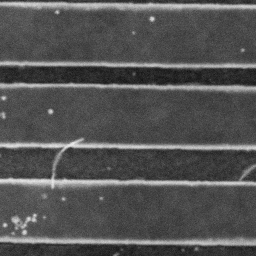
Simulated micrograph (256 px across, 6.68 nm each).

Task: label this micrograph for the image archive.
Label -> lines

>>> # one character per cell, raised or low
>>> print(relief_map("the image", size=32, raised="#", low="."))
#########.......................
################################
################################
################################
################################
################################
################################
################################
................................
................................
................................
################################
################################
################################
################################
################################
################################
################################
................################
................................
................................
................................
###...#.........................
################################
################################
################################
################################
################################
################################
################################
..................##.###########
................................